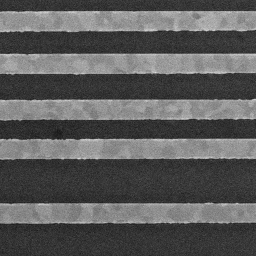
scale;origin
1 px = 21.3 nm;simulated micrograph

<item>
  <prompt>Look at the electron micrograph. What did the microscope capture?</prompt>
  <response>lines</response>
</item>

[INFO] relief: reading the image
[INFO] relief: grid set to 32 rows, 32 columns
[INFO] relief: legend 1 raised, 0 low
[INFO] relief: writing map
00000000000000000000000000000000
00000000000000000000000000000000
11111111111111111111111111111111
11111111111111111111111111111111
00000000000000000000000000000000
00000000000000000000000000000000
00000000000000000000000000000000
11111111111111111111111111111111
11111111111111111111111111111111
00000000000000000000000000000000
00000000000000000000000000000000
00000000000000000000000000000000
00000000000000000000000000000101
11111111111111111111111111111111
11111111111111111111111111111111
00000000000000000000000000000000
00000000000000000000000000000000
11101110111111111111111111111111
11111111111111111111111111111111
11111111111111111111111111111111
00000000000000000000000000000000
00000000000000000000000000000000
00000000000000000000000000000000
00000000000000000000000000000000
00000000000000000000000000000000
00000000000000000000000001100000
11111111111111111111111111111111
11111111111111111111111111111111
00000000000000000000000000000000
00000000000000000000000000000000
00000000000000000000000000000000
00000000000000000000000000000000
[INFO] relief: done